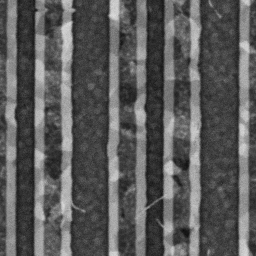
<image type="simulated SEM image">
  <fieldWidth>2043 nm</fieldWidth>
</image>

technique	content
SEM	one or a few lines or trenches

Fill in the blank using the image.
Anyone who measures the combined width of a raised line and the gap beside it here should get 514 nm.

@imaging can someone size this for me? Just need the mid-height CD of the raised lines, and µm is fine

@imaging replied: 0.205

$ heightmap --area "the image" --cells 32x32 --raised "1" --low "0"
10000111000000111100011100000001
10000111000000111100011100000001
10000111000000111100011100000001
10000111000000111100011100000001
10000111000000111100011100000001
10000111000000111100011100000001
10000111000000111100011100000001
10000111000000111100011100000001
10000111000000111100011100000001
10000111000000111100011100000001
10000111000000111100011100000001
10000111000000111100011100000001
10000111000000111100011100000001
10000111000000111000011100000001
10000111000000111000011100000001
10000111000000111000011100000001
10000111000000111000011100000001
10000111000000111100011100000001
10000111000000111100011100000001
10000111000000111100011100000001
10000111000000111100011100000001
10000111000000111000011100000001
10000111000000111100011100000001
10000111000000111100011100000001
10000111000000111100011100000001
10000111000000111100011100000001
10000111000000111100011100000001
10000111000000111000011100000001
10000111000000111000011100000001
10000111000000111100011100000001
10000111000000111000011100000001
10000111000000111000011100000001